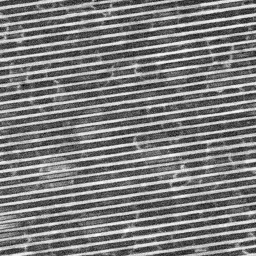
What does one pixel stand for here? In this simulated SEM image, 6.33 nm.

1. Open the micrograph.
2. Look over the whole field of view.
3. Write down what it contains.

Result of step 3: parallel lines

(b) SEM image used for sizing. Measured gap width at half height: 41.5 nanometers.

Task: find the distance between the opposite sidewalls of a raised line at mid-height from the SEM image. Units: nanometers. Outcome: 13.3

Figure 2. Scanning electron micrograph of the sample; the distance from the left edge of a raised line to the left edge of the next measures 53.8 nm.